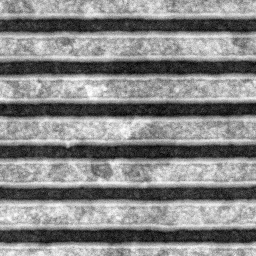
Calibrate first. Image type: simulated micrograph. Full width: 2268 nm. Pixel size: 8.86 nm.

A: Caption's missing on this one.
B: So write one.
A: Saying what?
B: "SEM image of parallel lines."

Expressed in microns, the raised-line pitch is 0.373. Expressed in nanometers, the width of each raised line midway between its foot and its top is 213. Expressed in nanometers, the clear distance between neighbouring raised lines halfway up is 164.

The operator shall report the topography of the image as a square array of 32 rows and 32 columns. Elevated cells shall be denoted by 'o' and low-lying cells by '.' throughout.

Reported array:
oooooooooooooooooooooooooooooooo
oooooooooooooooooooooooooooooooo
................................
................................
oooooooooooooooooooooooooooooooo
oooooooooooooooooooooooooooooooo
oooooooooooooooooooooooooooooooo
................................
................................
................................
oooooooooooooooooooooooooooooooo
oooooooooooooooooooooooooooooooo
ooooooooooo..oooooooooooooo..oo.
................................
................................
oooooooooooooooooooooooooooooooo
oooooooooooooooooooooooooooooooo
oooooooooooooooooooooooooooooooo
................................
................................
oooooooooooooooooooooooooooooooo
oooooooooooooooooooooooooooooooo
oooooooooooooooooooooooooooooooo
................................
................................
ooooooooooooooooo.oooooooooooooo
oooooooooooooooooooooooooooooooo
oooooooooooooooooooooooooooooooo
....................oo..........
................................
................................
oooooooooooooooooooooooooooooooo